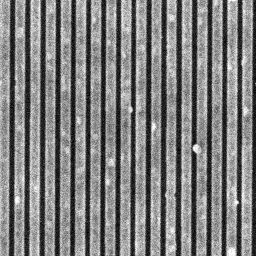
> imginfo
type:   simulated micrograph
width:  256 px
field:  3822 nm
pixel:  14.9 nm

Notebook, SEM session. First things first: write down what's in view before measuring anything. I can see parallel lines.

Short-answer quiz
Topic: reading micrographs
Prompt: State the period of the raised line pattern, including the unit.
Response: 226 nm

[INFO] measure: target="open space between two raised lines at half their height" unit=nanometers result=80.2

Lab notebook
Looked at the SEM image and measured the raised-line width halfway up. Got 0.145 microns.